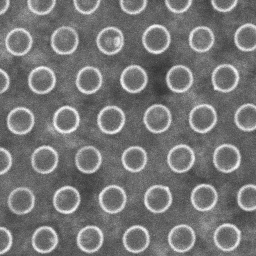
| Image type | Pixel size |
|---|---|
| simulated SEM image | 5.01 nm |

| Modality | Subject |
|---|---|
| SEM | a regular array of raised bodies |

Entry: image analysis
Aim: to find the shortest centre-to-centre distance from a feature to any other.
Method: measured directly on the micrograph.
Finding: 227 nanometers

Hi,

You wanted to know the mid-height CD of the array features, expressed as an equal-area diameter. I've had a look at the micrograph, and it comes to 0.133 micrometres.